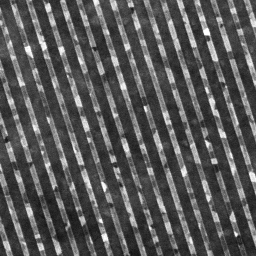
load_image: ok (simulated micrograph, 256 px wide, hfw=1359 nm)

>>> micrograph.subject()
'parallel lines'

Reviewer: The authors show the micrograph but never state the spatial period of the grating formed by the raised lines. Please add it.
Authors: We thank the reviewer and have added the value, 84.7 nanometers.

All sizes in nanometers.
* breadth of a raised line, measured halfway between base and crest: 24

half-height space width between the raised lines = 63.9 nm